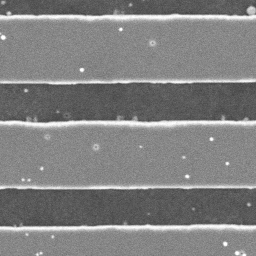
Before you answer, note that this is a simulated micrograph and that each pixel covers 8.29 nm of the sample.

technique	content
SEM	lines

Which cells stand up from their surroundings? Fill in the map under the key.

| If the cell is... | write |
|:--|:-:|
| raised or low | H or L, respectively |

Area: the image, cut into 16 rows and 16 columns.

LLLLLLLLLLLLLLLL
HHHHHHHHHHHHHHHH
HHHHHHHHHHHHHHHH
HHHHHHHHHHHHHHHH
HHHHHHHHHHHHHHHH
LLLLLLLLLLLLLLLL
LLLLLLLLLLLLLLLL
LLLLLLLLLLLLLLLL
HHHHHHHHHHHHHHHH
HHHHHHHHHHHHHHHH
HHHHHHHHHHHHHHHH
HHHHHHHHHHHHHHHH
LLLLLLLLLLLLLLLL
LLLLLLLLLLLLLLLL
HHHHHHHHHHHHHHHH
HHHHHHHHHHHHHHHH